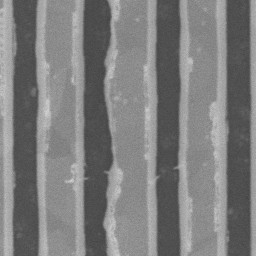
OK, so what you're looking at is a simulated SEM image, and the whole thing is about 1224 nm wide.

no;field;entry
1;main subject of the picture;one or a few lines or trenches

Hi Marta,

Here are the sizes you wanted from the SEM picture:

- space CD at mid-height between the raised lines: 156 nm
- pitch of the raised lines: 340 nm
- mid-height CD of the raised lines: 184 nm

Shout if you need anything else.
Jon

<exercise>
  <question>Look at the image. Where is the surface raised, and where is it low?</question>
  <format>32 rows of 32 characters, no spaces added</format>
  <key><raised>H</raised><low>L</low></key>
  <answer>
HLLLLHHHHHLLLLHHHHHLLLLHHHHHLLLL
HLLLLHHHHHLLLLHHHHHLLLLHHHHHLLLL
HLLLLHHHHHLLLLHHHHHLLLLHHHHHLLLL
HLLLLHHHHHLLLLHHHHHLLLLHHHHHLLLL
HLLLLHHHHHLLLLHHHHHLLLLHHHHHLLLL
HLLLLHHHHHLLLLHHHHHLLLLHHHHHLLLL
HLLLLHHHHHLLLLHHHHHLLLLHHHHHLLLL
HLLLLHHHHHLLLLHHHHHLLLLHHHHHLLLL
HLLLLHHHHHLLLLHHHHHLLLLHHHHHLLLL
HLLLLHHHHHLLLHHHHHHLLLLHHHHHLLLL
HLLLLHHHHHLLLHHHHHHLLLLHHHHHLLLL
HLLLLHHHHHLLLHHHHHHLLLLHHHHHLLLL
HLLLLHHHHHLLLLHHHHHLLLLHHHHHLLLL
HLLLLHHHHHLLLLHHHHHLLLLHHHHHLLLL
HLLLLHHHHHLLLLHHHHHLLLLHHHHHLLLL
HLLLLHHHHHLLLLHHHHHLLLLHHHHHLLLL
HLLLLHHHHHLLLLHHHHHLLLLHHHHHLLLL
HLLLLHHHHHLLLLHHHHHLLLLHHHHHLLLL
HLLLLHHHHHLLLLHHHHHLLLLHHHHHLLLL
HLLLLHHHHHLLLLHHHHHLLLLHHHHHLLLL
HLLLLHHHHHLLLLHHHHHLLLLHHHHHLLLL
HLLLLHHHHHLLLLHHHHHLLLLHHHHHLLLL
HLLLLHHHHHLLLLHHHHHLLLLHHHHHLLLL
HLLLLHHHHHLLLLHHHHHLLLLHHHHHLLLL
HLLLLHHHHHLLLLHHHHHLLLLHHHHHLLLL
HLLLLHHHHHLLLLHHHHHLLLLHHHHHLLLL
HLLLLHHHHHLLLLHHHHHLLLLHHHHHLLLL
HLLLLHHHHHLLLLHHHHHLLLLHHHHHLLLL
HLLLLHHHHHLLLHHHHHHLLLLHHHHHLLLL
HLLLLHHHHHLLLLHHHHHLLLLHHHHHLLLL
HLLLLHHHHHLLLLHHHHHLLLLHHHHHLLLL
HLLLLHHHHHLLLLHHHHHLLLLHHHHHLLLL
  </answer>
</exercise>